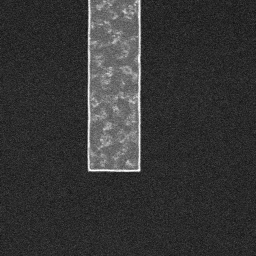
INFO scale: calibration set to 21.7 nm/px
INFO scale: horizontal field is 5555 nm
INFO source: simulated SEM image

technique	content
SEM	one or a few lines or trenches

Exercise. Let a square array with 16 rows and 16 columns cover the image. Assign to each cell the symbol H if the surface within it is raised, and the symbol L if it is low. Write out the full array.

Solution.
LLLLLLHHHLLLLLLL
LLLLLLHHHLLLLLLL
LLLLLLHHHLLLLLLL
LLLLLLHHHLLLLLLL
LLLLLLHHHLLLLLLL
LLLLLLHHHLLLLLLL
LLLLLLHHHLLLLLLL
LLLLLLHHHLLLLLLL
LLLLLLHHHLLLLLLL
LLLLLLHHHLLLLLLL
LLLLLLHHHLLLLLLL
LLLLLLLLLLLLLLLL
LLLLLLLLLLLLLLLL
LLLLLLLLLLLLLLLL
LLLLLLLLLLLLLLLL
LLLLLLLLLLLLLLLL